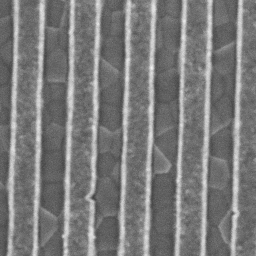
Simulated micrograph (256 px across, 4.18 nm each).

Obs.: parallel lines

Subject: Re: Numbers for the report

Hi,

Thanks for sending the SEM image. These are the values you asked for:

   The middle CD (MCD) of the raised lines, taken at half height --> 106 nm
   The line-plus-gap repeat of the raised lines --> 234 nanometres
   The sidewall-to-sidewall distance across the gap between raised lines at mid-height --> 127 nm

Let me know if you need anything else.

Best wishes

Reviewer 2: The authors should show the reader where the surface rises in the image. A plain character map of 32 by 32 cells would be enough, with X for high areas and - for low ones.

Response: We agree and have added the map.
--XXX----XXX----XXX----XXX----XX
--XXX----XXX----XXX----XXX----XX
--XXX----XXX----XXX----XXX----XX
--XXX----XXX----XXX----XXX----XX
--XXX----XXX----XXX----XXX----XX
--XXX----XXX----XXX----XXX----XX
--XXX----XXX----XXX----XXX----XX
--XXX----XXX----XXX----XXX----XX
--XXX----XXX----XXX----XXX----XX
--XXX----XXX----XXX----XXX----XX
--XXX----XXX----XXX----XXX----XX
--XXX----XXX----XXX----XXX----XX
--XXX----XXX----XXX----XXX----XX
--XXX----XXX----XXX----XXX----XX
--XXX----XXX----XXX----XXX----XX
--XXX----XXX----XXX----XXX----XX
--XXX----XXX----XXX----XXX----XX
--XXX----XXX----XXX----XXX----XX
--XXX----XXX----XXX----XXX----XX
--XXX----XXX---XXXX---XXXX----XX
--XXX---XXXX---XXXX---XXXX----XX
-XXXX----XXX---XXXX---XXXX----XX
-XXXX----XXX---XXXX---XXXX---XXX
-XXXX---XXXX---XXX----XXXX---XXX
-XXXX---XXX----XXX----XXXX---XXX
-XXXX---XXXX---XXX----XXXX---XXX
-XXXX---XXXX---XXX----XXXX---XXX
-XXX----XXX----XXX----XXXX---XXX
-XXX----XXX----XXX----XXXX---XXX
-XXX----XXX----XXX----XXX----XXX
-XXX----XXX----XXX----XXX----XXX
-XXX----XXX----XXX----XXX----XXX